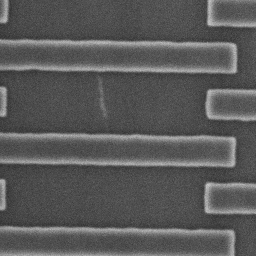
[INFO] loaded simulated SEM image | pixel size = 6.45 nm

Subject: groups of lines, slits or small figures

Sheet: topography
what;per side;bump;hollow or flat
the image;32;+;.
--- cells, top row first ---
+.........................++++++
+.........................++++++
+.........................++++++
................................
................................
+++++++++++++++++++++++++++++...
++++++++++++++++++++++++++++++..
++++++++++++++++++++++++++++++..
++++++++++++++++++++++++++++++..
................................
................................
+.........................++++++
+.........................++++++
+.........................++++++
..........................++++++
................................
................................
+++++++++++++++++++++++++++++...
+++++++++++++++++++++++++++++...
+++++++++++++++++++++++++++++...
.........++++++++++++++++++++...
................................
................................
+.........................++++++
+.........................++++++
+.........................++++++
..........................++++++
................................
+++.+++++.......................
+++++++++++++++++++++++++++++...
+++++++++++++++++++++++++++++...
+++++++++++++++++++++++++++++...